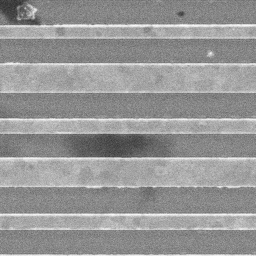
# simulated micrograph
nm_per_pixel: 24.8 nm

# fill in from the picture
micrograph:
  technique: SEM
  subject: lines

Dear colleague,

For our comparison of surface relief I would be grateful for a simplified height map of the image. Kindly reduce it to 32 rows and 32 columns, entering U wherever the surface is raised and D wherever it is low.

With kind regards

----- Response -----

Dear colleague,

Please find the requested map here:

DDDDDDDDDDDDDDDDDDDDDDDDDDDDDDDD
DDDUDDDDDDDDDDDDDDDDDDDDDDDDDDDD
DDDDDDDDDDDDDDDDDDDDDDDDDDDDDDDD
UUUUUUUUUUUUUUUUUUUUUUUUUUUUUUUU
UUUUUUUUUUUUUUUUUUUUUUUUUUUUUUUU
DDDDDDDDDDDDDDDDDDDDDDDDDDDDDDDD
DDDDDDDDDDDDDDDDDDDDDDDDDDDDDDDD
DDDDDDDDDDDDDDDDDDDDDDDDDDDDDDDD
UUUUUUUUUUUUUUUUUUUUUUUUUUUUUUUU
UUUUUUUUUUUUUUUUUUUUUUUUUUUUUUUU
UUUUUUUUUUUUUUUUUUUUUUUUUUUUUUUU
DDDDDDDDDDDDDDDDDDDDDDDDDDDDDDDD
DDDDDDDDDDDDDDDDDDDDDDDDDDDDDDDD
DDDDDDDDDDDDDDDDDDDDDDDDDDDDDDDD
DDDDDDDDDDDDDDDDDDDDDDDDDDDDDDDD
UUUUUUUUUUUUUUUUUUUUUUUUUUUUUUUU
UUUUUUUUUUUUUUUUUUUUUUUUUUUUUUUU
DDDDDDDDDDDDDDDDDDDDDDDDDDDDDDDD
DDDDDDDDDDDDDDDDDDDDDDDDDDDDDDDD
DDDDDDDDDDDDDDDDDDDDDDDDDDDDDDDD
UUUUUUUUUUUUUUUUUUUUUUUUUUUUUUUU
UUUUUUUUUUUUUUUUUUUUUUUUUUUUUUUU
UUUUUUUUUUUUUUUUUUUUUUUUUUUUUUUU
DDDDDDDDDDDDDDDDDDDDDDDDDDDDDDDD
DDDDDDDDDDDDDDDDDDDDDDDDDDDDDDDD
DDDDDDDDDDDDDDDDDDDDDDDDDDDDDDDD
DDDDDDDDDDDDDDDDDDDDDDDDDDDDDDDD
UUUUUUUUUUUUUUUUUUUUUUUUUUUUUUUU
UUUUUUUUUUUUUUUUUUUUUUUUUUUUUUUU
DDDDDDDDDDDDDDDDDDDDDDDDDDDDDDDD
DDDDDDDDDDDDDDDDDDDDDDDDDDDDDDDD
DDDDDDDDDDDDDDDDDDDDDDDDDDDDDDDD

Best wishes